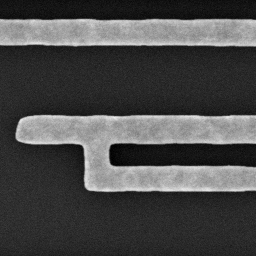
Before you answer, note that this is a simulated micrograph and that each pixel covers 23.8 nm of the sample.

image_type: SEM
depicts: wiring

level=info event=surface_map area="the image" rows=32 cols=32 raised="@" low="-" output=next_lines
--------------------------------
--------------------------------
---------@@@-------@------@@@---
@@@@@@@@@@@@@@@@@@@@@@@@@@@@@@@@
@@@@@@@@@@@@@@@@@@@@@@@@@@@@@@@@
@@@@@@@@@@@@@@@@@@@@@@@@@@@@@@@@
--------------------------------
--------------------------------
--------------------------------
--------------------------------
--------------------------------
--------------------------------
--------------------------------
--------------------------------
-----@@-------------------------
--@@@@@@@@@@@@@@@@@@@@@@@@@@@@@@
--@@@@@@@@@@@@@@@@@@@@@@@@@@@@@@
--@@@@@@@@@@@@@@@@@@@@@@@@@@@@@@
----------@@@@------------------
-----------@@@------------------
-----------@@@------------------
-----------@@@@@@@@@@@@@@@@@@@@@
-----------@@@@@@@@@@@@@@@@@@@@@
-----------@@@@@@@@@@@@@@@@@@@@@
--------------------------------
--------------------------------
--------------------------------
--------------------------------
--------------------------------
--------------------------------
--------------------------------
--------------------------------